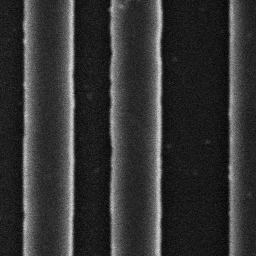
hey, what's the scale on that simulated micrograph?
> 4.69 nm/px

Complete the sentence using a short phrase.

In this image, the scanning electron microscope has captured lines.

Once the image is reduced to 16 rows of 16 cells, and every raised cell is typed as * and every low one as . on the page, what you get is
..***..***....**
..***..***....**
..***..***....**
..***..***....**
..***..***....**
..***..***....**
..***..***....**
..***..***....**
..***..***....**
..***..***....**
..***..***....**
..***..***....**
..***..***....**
..***..***....**
..***..***....**
..**...***....**